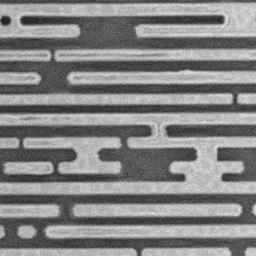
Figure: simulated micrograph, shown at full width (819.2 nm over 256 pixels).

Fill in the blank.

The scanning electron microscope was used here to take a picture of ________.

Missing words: parallel lines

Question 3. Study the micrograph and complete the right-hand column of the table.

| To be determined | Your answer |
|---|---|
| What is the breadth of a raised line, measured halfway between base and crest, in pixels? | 11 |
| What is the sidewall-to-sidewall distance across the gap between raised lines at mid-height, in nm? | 35.1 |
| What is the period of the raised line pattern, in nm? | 70.9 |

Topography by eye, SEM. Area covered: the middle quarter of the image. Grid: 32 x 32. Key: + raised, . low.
................................
................................
..++++++++++++++++++++++++++++++
.+++++++++++++++++++++++++++++++
..++++++++++++++++++++++++++++++
................................
................................
................................
++++++++++++++++++++++++++++++++
++++++++++++++++++++++++++++++++
................................
................................
................................
++++++++++++++++++++++++++++++++
++++++++++++++++++++++++++++++++
......................++++......
......................+++.......
......................++++......
.....................+++++....++
++++++++++++++..++++++++++++++++
++++++++++++++...+++++++++++++++
...++++++.......................
...+++++........................
...++++++.......................
..+++++++.......................
++++++++++++++.............+++++
++++++++++++++.............+++++
..............................++
...............................+
..............................++
++++++++++++++++++++++++++++++++
++++++++++++++++++++++++++++++++